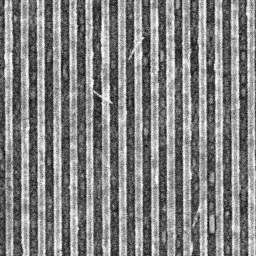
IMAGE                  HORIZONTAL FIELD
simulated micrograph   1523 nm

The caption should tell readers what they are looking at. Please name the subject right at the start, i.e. parallel lines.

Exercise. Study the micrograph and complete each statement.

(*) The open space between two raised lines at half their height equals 55.8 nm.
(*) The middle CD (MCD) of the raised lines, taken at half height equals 0.0409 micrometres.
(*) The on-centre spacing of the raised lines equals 0.0962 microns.